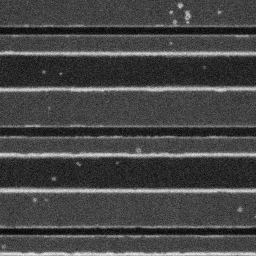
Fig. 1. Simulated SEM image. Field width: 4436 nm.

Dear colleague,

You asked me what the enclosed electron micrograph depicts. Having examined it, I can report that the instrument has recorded lines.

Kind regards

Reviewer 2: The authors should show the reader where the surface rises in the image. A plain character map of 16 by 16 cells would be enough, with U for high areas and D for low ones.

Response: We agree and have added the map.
UUUUUUUUUUUUUUUU
UUUUUUUUUUUUUUUU
UUUUUUUUUUUUUUUU
DDDDDDDDDDDDDDDD
DDDDDDDDDDDDDDDD
DDDDDDDDDDDDDDDD
UUUUUUUUUUUUUUUU
UUUUUUUUUUUUUUUU
UUUUUUUUUUUUUUUU
UUUUUUUUUUUUUUUU
DDDDDDDDDDDDDDDD
DDDDDDDDDDDDDDDD
UUUUUUUUUUUUUUUU
UUUUUUUUUUUUUUUU
UUUUUUUUUUUUUUUU
UUUUUUUUUUUUUUUU